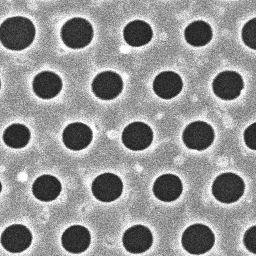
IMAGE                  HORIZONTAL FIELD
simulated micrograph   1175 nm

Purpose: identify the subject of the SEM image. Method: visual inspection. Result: a regular array of holes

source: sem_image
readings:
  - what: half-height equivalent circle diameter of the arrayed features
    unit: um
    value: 0.136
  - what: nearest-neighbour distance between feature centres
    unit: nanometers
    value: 273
